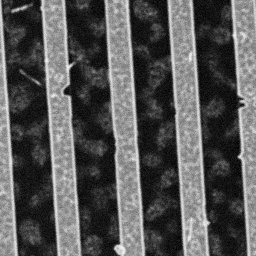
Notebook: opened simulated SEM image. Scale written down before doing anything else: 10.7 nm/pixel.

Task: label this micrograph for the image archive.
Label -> one or a few lines or trenches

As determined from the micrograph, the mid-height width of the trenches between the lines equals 440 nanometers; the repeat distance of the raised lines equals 0.678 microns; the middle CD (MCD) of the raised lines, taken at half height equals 0.234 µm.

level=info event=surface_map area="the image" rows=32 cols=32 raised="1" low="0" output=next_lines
00000111000001110000011100000111
00000111000001110000011100000111
00000011000001110000011100000111
00000111000001110000011100000111
00000011000000110000011100000111
00000011000001110000011100000111
00000011000000110000011100000111
00000011000000110000001100000011
10000011100000110000001100000011
10000011100000111000001110000011
10000011000000111000001110000011
10000011000000111000001110000011
10000011100000111000001110000011
10000011100000111000001110000011
10000011100000111000001110000011
10000011100000111000001110000011
10000011100000111000001110000011
10000011100000011000001110000011
10000011100000011000001110000011
10000011100000011000001110000011
10000001100000011000001110000011
10000001100000011000001110000011
10000001100000011000001110000001
11000001100000011000000110000001
11000001100000011100000111000001
11000001110000011100000111000001
11000001110000011100000111000001
11000001110000011100000111000001
11000001110000011100000111000001
11000001110000011100000111000001
11000001110000011100000111000001
11000001110000011100000111000001